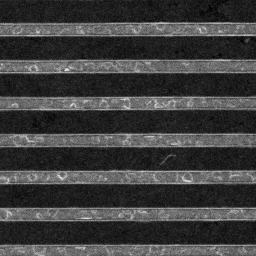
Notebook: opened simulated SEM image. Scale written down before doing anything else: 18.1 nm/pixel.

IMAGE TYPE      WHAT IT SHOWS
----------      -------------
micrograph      parallel lines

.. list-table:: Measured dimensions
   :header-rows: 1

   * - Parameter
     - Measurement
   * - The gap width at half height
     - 0.202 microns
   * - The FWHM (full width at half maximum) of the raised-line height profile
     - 469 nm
